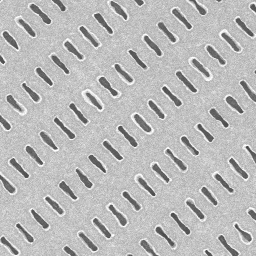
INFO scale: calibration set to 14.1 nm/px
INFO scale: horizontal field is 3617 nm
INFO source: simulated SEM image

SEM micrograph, a regular array of holes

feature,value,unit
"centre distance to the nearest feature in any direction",0.281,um